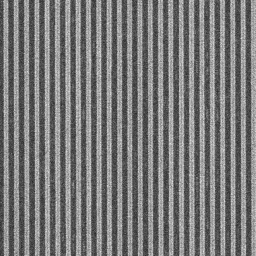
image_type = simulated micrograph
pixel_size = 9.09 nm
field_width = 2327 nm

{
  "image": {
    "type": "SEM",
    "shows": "parallel lines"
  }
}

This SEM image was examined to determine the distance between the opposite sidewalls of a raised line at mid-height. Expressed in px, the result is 3.75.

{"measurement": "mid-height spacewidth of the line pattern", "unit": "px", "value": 6.62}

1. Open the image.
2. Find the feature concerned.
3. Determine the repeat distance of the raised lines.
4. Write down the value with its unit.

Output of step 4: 93.8 nm